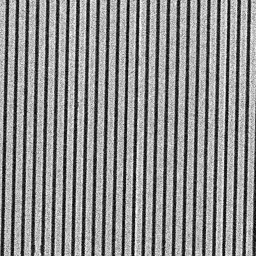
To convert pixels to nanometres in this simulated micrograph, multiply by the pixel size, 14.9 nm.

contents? parallel lines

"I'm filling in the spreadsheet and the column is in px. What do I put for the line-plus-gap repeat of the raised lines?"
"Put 10.1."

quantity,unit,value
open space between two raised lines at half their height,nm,50.4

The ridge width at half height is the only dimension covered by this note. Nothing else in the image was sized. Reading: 101 nm